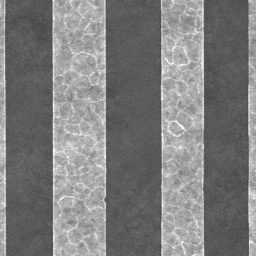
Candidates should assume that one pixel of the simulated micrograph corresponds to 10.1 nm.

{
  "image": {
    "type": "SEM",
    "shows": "one or a few lines or trenches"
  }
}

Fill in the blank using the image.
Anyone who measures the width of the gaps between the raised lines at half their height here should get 487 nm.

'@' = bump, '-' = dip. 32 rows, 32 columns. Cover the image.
@------@@@@@@-------@@@@@------@
@------@@@@@@-------@@@@@------@
@------@@@@@@-------@@@@@------@
@------@@@@@@-------@@@@@------@
@------@@@@@@-------@@@@@------@
@------@@@@@@-------@@@@@------@
@------@@@@@@-------@@@@@------@
@------@@@@@@-------@@@@@------@
@------@@@@@@-------@@@@@------@
@------@@@@@@-------@@@@@------@
@------@@@@@@-------@@@@@------@
@------@@@@@@-------@@@@@------@
@------@@@@@@-------@@@@@------@
@------@@@@@@-------@@@@@------@
@------@@@@@@-------@@@@@------@
@------@@@@@@-------@@@@@------@
@------@@@@@@-------@@@@@------@
@------@@@@@@-------@@@@@------@
@------@@@@@@-------@@@@@------@
@------@@@@@@-------@@@@@------@
@------@@@@@@-------@@@@@------@
@------@@@@@@-------@@@@@------@
@------@@@@@@-------@@@@@------@
@------@@@@@@-------@@@@@------@
@------@@@@@@-------@@@@@------@
@------@@@@@@-------@@@@@------@
@------@@@@@@-------@@@@@------@
@------@@@@@@-------@@@@@------@
@------@@@@@@-------@@@@@------@
@------@@@@@@-------@@@@@------@
@------@@@@@@-------@@@@@------@
@------@@@@@@-------@@@@@------@